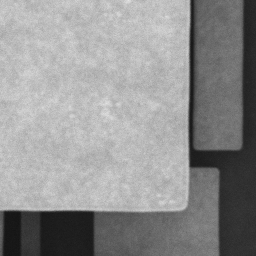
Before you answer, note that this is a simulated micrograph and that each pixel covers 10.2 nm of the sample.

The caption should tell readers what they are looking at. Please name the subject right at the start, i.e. wiring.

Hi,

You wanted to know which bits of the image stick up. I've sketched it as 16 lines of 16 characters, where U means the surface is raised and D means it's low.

UUUUUUUUUUUUDDDD
UUUUUUUUUUUUDDDD
UUUUUUUUUUUUDDDD
UUUUUUUUUUUUDDDD
UUUUUUUUUUUUDDDD
UUUUUUUUUUUUDDDD
UUUUUUUUUUUUDDDD
UUUUUUUUUUUUDDDD
UUUUUUUUUUUUDDDD
UUUUUUUUUUUUDDDD
UUUUUUUUUUUUDDDD
UUUUUUUUUUUUDDDD
UUUUUUUUUUUUDDDD
DDDDDDDDDDDDDDDD
DDDDDDDDDDDDDDDD
DDDDDDDDDDDDDDDD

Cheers